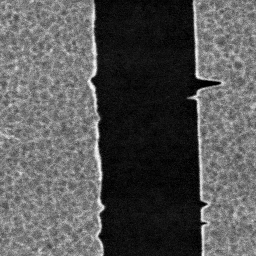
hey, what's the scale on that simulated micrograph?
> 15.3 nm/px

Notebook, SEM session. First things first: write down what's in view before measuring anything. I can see one or a few lines or trenches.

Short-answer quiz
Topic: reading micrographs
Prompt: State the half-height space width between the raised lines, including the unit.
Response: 1.56 micrometres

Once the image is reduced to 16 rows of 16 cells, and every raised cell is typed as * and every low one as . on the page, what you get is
******......****
******......****
******......****
******......****
******......****
******.......***
******......****
******......****
******......****
******......****
******.......***
******.......***
******.......***
******.......***
******.......***
******.......***